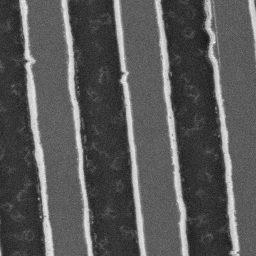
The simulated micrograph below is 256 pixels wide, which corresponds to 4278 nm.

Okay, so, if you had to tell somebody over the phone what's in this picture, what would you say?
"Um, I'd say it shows one or a few lines or trenches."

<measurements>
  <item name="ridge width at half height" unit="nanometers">714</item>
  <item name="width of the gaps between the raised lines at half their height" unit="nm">838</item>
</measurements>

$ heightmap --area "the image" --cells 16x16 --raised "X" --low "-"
-XXX---XXX---XXX
-XXX---XXX---XXX
--XX----XX---XXX
--XX----XX---XXX
--XX----XX----XX
--XXX---XX----XX
--XXX---XXX---XX
--XXX---XXX---XX
--XXX---XXX---XX
--XXX---XXX---XX
---XX---XXX---XX
---XX---XXX---XX
---XX----XX---XX
---XX----XX---XX
---XXX---XXX---X
---XXX---XXX---X